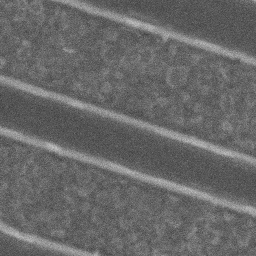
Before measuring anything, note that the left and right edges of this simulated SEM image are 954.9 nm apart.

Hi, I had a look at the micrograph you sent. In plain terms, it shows one or a few lines or trenches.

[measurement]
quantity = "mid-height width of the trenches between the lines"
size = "344 nanometres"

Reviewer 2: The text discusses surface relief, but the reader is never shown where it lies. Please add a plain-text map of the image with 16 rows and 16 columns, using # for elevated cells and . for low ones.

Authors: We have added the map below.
.....###########
........########
............####
...............#
................
##..............
#####...........
########........
.##########.....
....##########..
.......#########
..........######
.............###
................
#...............
####............